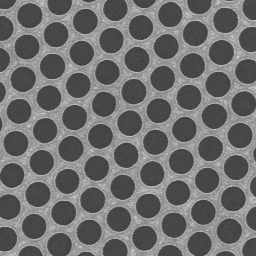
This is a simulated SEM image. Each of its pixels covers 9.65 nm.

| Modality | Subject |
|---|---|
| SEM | a regular array of holes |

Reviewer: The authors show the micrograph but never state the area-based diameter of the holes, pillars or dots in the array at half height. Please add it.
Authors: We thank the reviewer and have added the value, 239 nm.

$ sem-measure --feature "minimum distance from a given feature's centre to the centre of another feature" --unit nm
306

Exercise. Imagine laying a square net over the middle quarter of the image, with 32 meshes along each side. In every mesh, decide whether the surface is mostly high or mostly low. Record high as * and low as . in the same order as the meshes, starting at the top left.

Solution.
********.....***.....***.****...
********......**....**.....**...
**...***......********......**..
*.....**.....*********......***.
*......**....**....***......****
.......********.....**.....***..
*.....********.......**...***...
*.....**....**.......*******....
***.***......**.....********....
*******......***...***....**....
*...***......********......**...
.....**......********......*****
......**....**.....**......*****
......********.....**.....***..*
......*******......***...***....
.....***...**......********.....
**.***......**.....***.****.....
******......***...***....**.....
...***......********......**....
....**......********......******
.....**....***....**......******
.....********.....**.....***...*
.....*******.......***..***.....
....**....**......********......
******.....**.....***..***......
*****......***...***....**......
..***......********......**....*
...**......********......****.**
....**....***....**......*******
....********.....***....***...**
....********......***.****.....*
...**....***......********.....*